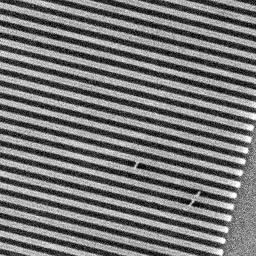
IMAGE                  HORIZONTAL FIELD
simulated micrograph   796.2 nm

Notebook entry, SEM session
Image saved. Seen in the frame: parallel lines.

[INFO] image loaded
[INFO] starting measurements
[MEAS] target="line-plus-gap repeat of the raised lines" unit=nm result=36.2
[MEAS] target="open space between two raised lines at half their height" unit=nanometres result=20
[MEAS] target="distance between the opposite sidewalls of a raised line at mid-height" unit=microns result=0.017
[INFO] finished